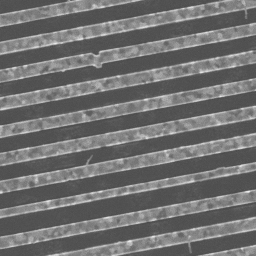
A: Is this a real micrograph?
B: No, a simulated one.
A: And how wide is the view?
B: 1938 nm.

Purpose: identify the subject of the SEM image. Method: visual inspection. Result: parallel lines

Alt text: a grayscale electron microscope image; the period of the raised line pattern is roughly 0.207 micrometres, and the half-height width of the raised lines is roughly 0.0857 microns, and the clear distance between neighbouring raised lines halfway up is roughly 118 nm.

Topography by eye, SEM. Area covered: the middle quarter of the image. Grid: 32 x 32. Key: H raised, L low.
HHHHHLLLHLLLLLLLLLLLLLLLLLLLHHHH
LLLLLLLLLLLLLLLLLLLLLLLHHHHHHHHH
LLLLLLLLLLLLLLLLLLHHHHHHHHHHHHHH
LLLLLLLLLLLHHHHHHHHHHHHHHHHLLLLL
LLLLLLHHHHHHHHHHHHHHHHLLLLLLLLLL
HHHHHHHHHHHHHHHHLLLLLLLLLLLLLLLL
HHHHHHHHHHHLLLLLLLLLLLLLLLLLLLLL
HHHHHHLLLLLLLLLLLLLLLLLLLLLLHHHH
LLLLLLLLLLLLLLLLLLLLLLHHHHHHHHHH
LLLLLLLLLLLLLLLLLHHHHHHHHHHHHHHH
LLLLLLLLLLLHHHHHHHHHHHHHHHLLLLLL
LLLLLLHHHHHHHHHHHHHHHLLLLLLLLLLL
LHHHHHHHHHHHHHHLLLLLLLLLLLLLLLLL
HHHHHHHHHHLLLLLLLLLLLLLLLLLLLLLL
HHHHHLLLLLLLLLLLLLLLLLLLLLLHHHHH
LLLLLLLLLLLLLLLLLLLLLHHHHHHHHHHH
LLLLLLLLLLLLLLLLHHHHHHHHHHHHHHHH
LLLLLLLLLLHHHHHHHHHHHHHHHHHLLLLL
LLLLLHHHHHHHHHHHHHHHHLLLLLLLLLLL
HHHHHHHHHHHHHHHHLLLLLLLLLLLLLLLL
HHHHHHHHHHLLLLLLLLLLLLLLLLLLLLLH
HHHHHLLLLLLLLLLLLLLLLLLLLLHHHHHH
LLLLLLLLLLLLLLLLLLLLLLHHHHHHHHHH
LLLLLLLLLLLLLLLLHHHHHHHHHHHHHHHL
LLLLLLLLLLLHHHHHHHHHHHHHHHHLLLLL
LLLLLHHHHHHHHHHHHHHHHHLLLLLLLLLL
HHHHHHHHHHHHHHHLLLLLLLLLLLLLLLLL
HHHHHHHHHHLLLLLLLLLLLLLLLLLLLLLL
HHHHLLLLLLLLLLLLLLLLLLLLLLLHHHHH
LLLLLLLLLLLLLLLLLLLLLLHHHHHHHHHH
LLLLLLLLLLLLLLLLLHHHHHHHHHHLLLLL
LLLLLLLLLLLHHHHHHHHHHLLLLLLLLLLL